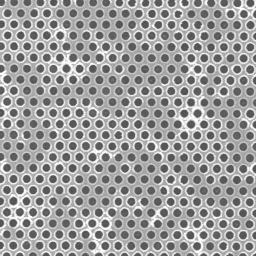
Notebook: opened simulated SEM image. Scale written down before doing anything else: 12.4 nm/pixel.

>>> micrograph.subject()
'a regular array of holes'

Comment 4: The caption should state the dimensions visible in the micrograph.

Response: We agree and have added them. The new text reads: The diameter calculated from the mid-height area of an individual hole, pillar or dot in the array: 105 nanometres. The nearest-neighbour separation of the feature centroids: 157 nanometres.